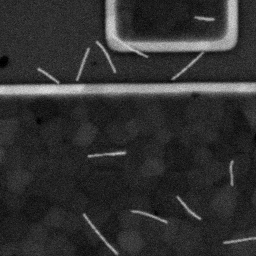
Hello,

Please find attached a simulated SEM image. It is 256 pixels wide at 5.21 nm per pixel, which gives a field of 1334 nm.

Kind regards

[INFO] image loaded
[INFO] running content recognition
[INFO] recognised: wiring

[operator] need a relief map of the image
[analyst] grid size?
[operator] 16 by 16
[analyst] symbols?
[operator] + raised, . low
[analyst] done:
.......++++++++.
.......++++++++.
.......+++++++..
................
................
...........+++++
++++++++++++++++
++++++++++++++++
++++++++++++++++
++++++++++++++++
++++++++++++++++
++++++++++++++++
++++++++++++++++
++++++++++++++++
++++++++++++++++
++++++++++++++++